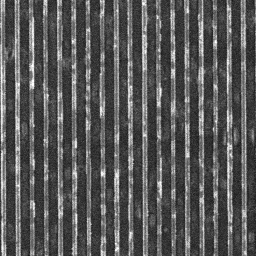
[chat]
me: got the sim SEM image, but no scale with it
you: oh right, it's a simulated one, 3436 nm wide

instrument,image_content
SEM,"parallel lines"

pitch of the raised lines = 0.19 µm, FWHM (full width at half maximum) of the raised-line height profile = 0.0486 µm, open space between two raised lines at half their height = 144 nanometres